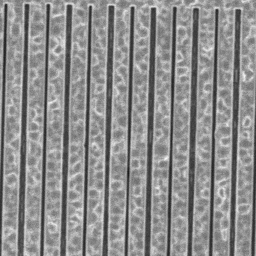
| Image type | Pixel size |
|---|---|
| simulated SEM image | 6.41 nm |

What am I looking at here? parallel lines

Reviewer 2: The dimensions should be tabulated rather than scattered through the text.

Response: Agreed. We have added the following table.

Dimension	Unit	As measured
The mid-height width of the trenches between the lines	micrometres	0.0352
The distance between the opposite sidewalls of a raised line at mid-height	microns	0.1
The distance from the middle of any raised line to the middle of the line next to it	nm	136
